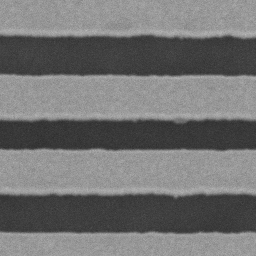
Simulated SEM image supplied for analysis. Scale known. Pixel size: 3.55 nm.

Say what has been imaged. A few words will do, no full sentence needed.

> lines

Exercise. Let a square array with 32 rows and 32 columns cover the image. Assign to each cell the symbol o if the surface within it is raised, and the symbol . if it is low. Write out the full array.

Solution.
oooooooooooooooooooooooooooooooo
oooooooooooooooooooooooooooooooo
oooooooooooooooooooooooooooooooo
oooooooooooooooooooooooooooooooo
......o........o....oo.ooooo.ooo
................................
................................
................................
................................
oooo.oooooooooooo.ooo.oooooo.ooo
oooooooooooooooooooooooooooooooo
oooooooooooooooooooooooooooooooo
oooooooooooooooooooooooooooooooo
oooooooooooooooooooooooooooooooo
oooooooooooooooooooooooooooooooo
................................
................................
................................
................................
oooooooooooooooooooooooooooooooo
oooooooooooooooooooooooooooooooo
oooooooooooooooooooooooooooooooo
oooooooooooooooooooooooooooooooo
oooooooooooooooooooooooooooooooo
................................
................................
................................
................................
................................
oooooooooooooooooooooooooooooooo
oooooooooooooooooooooooooooooooo
oooooooooooooooooooooooooooooooo